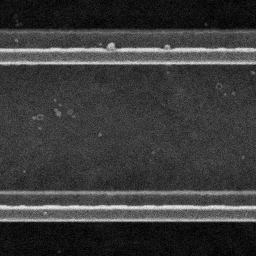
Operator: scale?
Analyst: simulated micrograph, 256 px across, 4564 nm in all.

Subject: lines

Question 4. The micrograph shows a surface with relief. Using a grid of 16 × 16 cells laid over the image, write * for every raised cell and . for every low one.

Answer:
................
................
****************
****************
................
................
................
................
................
................
................
................
****************
****************
................
................